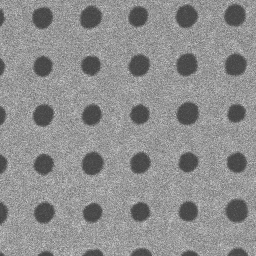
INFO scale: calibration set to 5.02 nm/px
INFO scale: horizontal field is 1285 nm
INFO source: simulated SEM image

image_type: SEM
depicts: a regular array of holes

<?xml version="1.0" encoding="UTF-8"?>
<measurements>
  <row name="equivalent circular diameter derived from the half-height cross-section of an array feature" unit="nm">100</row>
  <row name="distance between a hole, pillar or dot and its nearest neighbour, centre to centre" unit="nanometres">241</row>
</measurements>